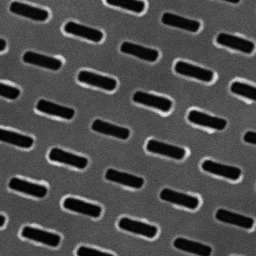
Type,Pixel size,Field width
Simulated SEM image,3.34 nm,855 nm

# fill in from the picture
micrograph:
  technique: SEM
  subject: a regular array of holes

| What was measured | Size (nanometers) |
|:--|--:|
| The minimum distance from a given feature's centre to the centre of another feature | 168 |